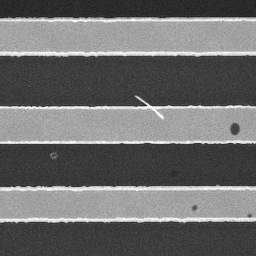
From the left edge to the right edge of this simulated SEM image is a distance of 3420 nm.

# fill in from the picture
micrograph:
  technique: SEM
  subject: lines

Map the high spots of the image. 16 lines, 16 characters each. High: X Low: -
----------------
XXXXXXXXXXXXXXXX
XXXXXXXXXXXXXXXX
----------------
----------------
----------------
----------------
XXXXXXXXXXXXXXXX
XXXXXXXXXXXXXXXX
----------------
----------------
----------------
XXXXXXXXXXXXXXXX
XXXXXXXXXXXXXXXX
----------------
----------------